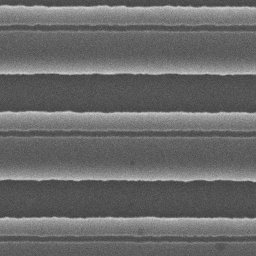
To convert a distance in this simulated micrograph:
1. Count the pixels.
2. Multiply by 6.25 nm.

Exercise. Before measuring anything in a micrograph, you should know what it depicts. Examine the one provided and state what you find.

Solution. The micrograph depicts lines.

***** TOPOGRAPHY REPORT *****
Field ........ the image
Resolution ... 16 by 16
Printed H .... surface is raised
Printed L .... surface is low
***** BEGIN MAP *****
HHHHHHHHHHHHHHHH
HHHHHHHHHHHHHHHH
HHHHHHHHHHHHHHHH
HHHHHHHHHHHHHHHH
HHHHHHHHHHHHHHHH
LLLLLLLLLLLLLLLL
LLLLLLLLLLLLLLLL
HHHHHHHHHHHHHHHH
HHHHHHHHHHHHHHHH
HHHHHHHHHHHHHHHH
HHHHHHHHHHHHHHHH
LLLLLLLLLLLLLLLL
LLLLLLLLLLLLLLLL
LLLLLLLLLLLLLLLL
HHHHHHHHHHHHHHHH
HHHHHHHHHHHHHHHH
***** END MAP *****